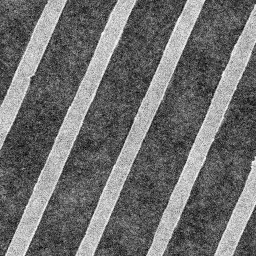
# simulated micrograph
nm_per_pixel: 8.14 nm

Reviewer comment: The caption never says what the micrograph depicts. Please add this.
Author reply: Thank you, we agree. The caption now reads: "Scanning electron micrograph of one or a few lines or trenches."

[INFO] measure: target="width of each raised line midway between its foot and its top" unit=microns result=0.126